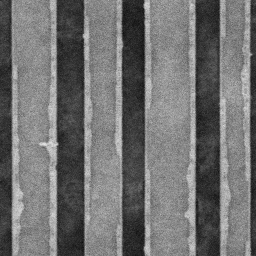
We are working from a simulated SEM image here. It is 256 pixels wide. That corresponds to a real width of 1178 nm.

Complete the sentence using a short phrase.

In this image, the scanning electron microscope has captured one or a few lines or trenches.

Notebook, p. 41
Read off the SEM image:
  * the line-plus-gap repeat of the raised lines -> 309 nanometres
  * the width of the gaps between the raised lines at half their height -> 119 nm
